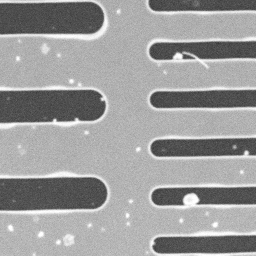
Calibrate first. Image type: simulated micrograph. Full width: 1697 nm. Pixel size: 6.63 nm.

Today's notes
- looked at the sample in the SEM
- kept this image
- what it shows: groups of lines, slits or small figures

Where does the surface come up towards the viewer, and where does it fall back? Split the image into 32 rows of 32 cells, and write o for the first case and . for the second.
............ooooooo.............
.............ooooooooooooooooooo
.............ooooooooooooooooooo
.............ooooooooooooooooooo
oooooooooooooooooooooooooooooooo
ooooooooooooooooooo.............
ooooooooooooooooooo.............
oooooooooooooooooooo..oooooooooo
oooooooooooooooooooooooooooooooo
oooooooooooooooooooooooooooooooo
oooooooooooooooooooooooooooooooo
............ooooooo.............
.............oooooo.............
.............ooooooo.........ooo
.............ooooooooooooooooooo
..oooooooooooooooooooooooooooooo
oooooooooooooooooooooooooooooooo
ooooooooooooooooooo.............
ooooooooooooooooooo.............
ooooooooooooooooooo.............
oooooooooooooooooooooooooooooooo
oooooooooooooooooooooooooooooooo
.............ooooooooooooooooooo
.............ooooooo............
.............oooooo....o........
.............oooooo....oo.......
oooooooooooooooooooooooooooooooo
oooooooooooooooooooooooooooooooo
oooooooooooooooooooooooooooooooo
ooooooooooooooooooooo...........
ooooooooooooooooooo.............
ooooooooooooooooooo.............